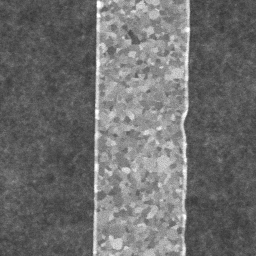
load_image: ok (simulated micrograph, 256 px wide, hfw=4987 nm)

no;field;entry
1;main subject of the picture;one or a few lines or trenches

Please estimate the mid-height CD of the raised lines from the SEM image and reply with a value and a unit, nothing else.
1750 nanometres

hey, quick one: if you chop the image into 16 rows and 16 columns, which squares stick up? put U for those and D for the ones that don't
DDDDDDUUUUUUDDDD
DDDDDDUUUUUUDDDD
DDDDDDUUUUUUDDDD
DDDDDDUUUUUUDDDD
DDDDDDUUUUUUDDDD
DDDDDDUUUUUUDDDD
DDDDDDUUUUUUDDDD
DDDDDDUUUUUDDDDD
DDDDDDUUUUUDDDDD
DDDDDDUUUUUUDDDD
DDDDDDUUUUUUDDDD
DDDDDDUUUUUUDDDD
DDDDDDUUUUUDDDDD
DDDDDDUUUUUUDDDD
DDDDDDUUUUUDDDDD
DDDDDDUUUUUDDDDD